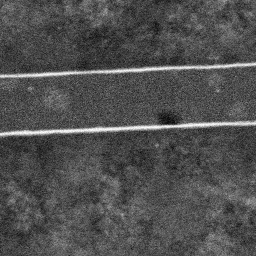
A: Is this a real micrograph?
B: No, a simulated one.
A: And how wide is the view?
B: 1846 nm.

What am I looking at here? one or a few lines or trenches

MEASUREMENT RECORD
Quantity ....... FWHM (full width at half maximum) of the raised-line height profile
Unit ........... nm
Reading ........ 415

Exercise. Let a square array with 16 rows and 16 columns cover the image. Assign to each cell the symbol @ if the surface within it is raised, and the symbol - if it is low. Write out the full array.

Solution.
----------------
----------------
----------------
----------------
------@@@@@@@@@@
@@@@@@@@@@@@@@@@
@@@@@@@@@@@@@@@@
@@@@@@@@@@@@@@@@
----------------
----------------
----------------
----------------
----------------
----------------
----------------
----------------